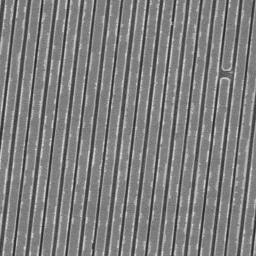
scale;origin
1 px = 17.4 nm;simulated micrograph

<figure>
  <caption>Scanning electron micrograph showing parallel lines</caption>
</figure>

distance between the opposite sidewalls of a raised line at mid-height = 174 nm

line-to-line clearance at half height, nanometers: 62.5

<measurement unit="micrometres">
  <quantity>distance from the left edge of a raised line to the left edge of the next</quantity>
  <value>0.228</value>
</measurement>